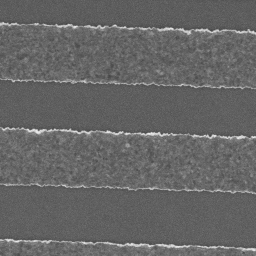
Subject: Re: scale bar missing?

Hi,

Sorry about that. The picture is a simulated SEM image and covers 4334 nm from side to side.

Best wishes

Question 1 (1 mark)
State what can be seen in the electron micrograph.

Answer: one or a few lines or trenches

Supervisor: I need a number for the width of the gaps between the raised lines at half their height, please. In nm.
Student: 879